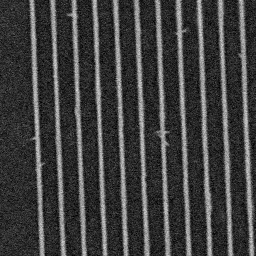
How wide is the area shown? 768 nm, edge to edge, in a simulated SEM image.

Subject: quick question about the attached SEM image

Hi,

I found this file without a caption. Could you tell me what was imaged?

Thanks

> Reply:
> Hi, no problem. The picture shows parallel lines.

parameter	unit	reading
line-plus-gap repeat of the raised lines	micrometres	0.0627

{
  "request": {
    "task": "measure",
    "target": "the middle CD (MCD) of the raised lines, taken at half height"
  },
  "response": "12.7 nm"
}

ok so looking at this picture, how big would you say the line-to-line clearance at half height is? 50.2 nm